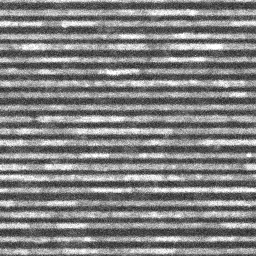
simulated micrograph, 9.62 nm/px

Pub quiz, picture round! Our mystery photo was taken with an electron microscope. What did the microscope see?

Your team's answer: parallel lines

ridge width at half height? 0.0373 microns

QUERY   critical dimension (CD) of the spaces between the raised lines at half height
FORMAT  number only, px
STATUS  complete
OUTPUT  7.75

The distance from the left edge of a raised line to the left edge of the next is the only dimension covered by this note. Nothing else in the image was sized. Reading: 0.115 micrometres